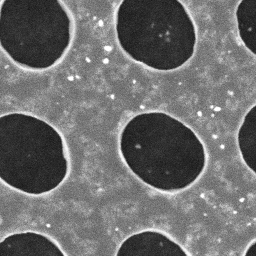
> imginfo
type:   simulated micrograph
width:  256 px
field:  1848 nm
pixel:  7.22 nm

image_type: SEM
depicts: holes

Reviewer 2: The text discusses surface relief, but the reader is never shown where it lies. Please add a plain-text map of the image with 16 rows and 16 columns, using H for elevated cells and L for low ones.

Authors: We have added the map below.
LLLLHHHLLLLLHHHL
LLLLHHHLLLLLHHHL
LLLLHHHLLLLLHHHL
HLLLHHHHLLLLHHHH
HHHHHHHHHHHHHHHH
HHHHHHHHHHHHHHHH
HHHHHHHHHHHHHHHH
LLLHHHHHLLLHHHHL
LLLLHHHHLLLLHHHL
LLLLHHHHLLLLLHHL
LLLLHHHHLLLLLHHH
HLLLHHHHHLLLHHHH
HHHHHHHHHHHHHHHH
HHHHHHHHHHHHHHHH
HHHHHHHHHLHHHHHH
LLLLHHHHLLLHHHHL